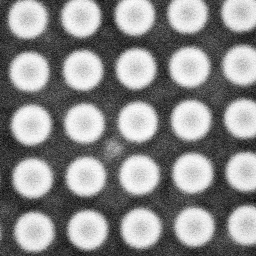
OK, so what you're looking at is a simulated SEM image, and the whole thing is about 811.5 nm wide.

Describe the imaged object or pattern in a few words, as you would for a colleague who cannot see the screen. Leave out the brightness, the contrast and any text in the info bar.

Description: an array of small figures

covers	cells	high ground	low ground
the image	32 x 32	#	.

..###....###...####..####...####
.#####..####...####..#####..####
.#####..####...####..#####..####
.####...####...###....###....##.
..##............................
................................
................##....###....###
..###...####...####...####..####
.#####..#####..####..#####..####
.#####..#####..####...####..####
..###....###....##.....##.......
................................
................................
...##....###....###...####...###
..####..#####..####...####..####
..####..#####..####...####..####
..####..#####..####...####...###
..###.....##.....#..............
................................
.......................##.....##
...###...###....###...####...###
..####..#####..#####..####..####
..####..#####..#####..####...###
..####...####...###....###....##
...##...........................
................................
..........#......##....###...###
..####...####...####..####...###
..#####..####..#####..#####..###
..#####..####..#####..####...###
...###...###....###....##.......
................................